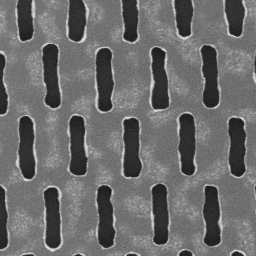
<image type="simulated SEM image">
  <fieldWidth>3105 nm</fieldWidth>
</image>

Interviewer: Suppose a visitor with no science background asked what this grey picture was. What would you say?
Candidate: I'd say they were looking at a regular array of holes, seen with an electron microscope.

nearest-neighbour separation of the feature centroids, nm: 628